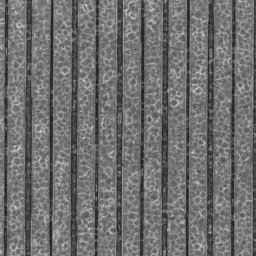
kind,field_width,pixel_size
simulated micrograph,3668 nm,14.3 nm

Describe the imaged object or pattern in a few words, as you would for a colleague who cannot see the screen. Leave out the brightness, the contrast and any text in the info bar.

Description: parallel lines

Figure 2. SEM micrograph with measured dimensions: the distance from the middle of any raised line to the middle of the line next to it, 326 nanometres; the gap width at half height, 51.9 nm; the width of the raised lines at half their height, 251 nm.